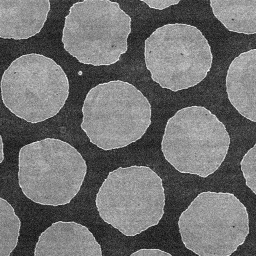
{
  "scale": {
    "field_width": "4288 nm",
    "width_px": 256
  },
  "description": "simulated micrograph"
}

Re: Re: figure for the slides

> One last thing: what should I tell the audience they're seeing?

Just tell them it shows raised bodies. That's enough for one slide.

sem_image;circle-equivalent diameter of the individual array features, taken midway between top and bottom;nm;1130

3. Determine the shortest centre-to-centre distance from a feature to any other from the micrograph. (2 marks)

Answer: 1.43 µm